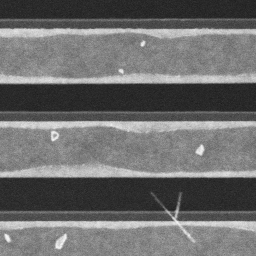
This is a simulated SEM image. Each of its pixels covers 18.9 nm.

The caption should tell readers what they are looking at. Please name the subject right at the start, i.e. lines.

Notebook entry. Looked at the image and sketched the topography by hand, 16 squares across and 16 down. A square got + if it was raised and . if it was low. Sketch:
................
++++++++++++++++
++++++++++++++++
++++++++++++++++
++++++++++++++++
................
................
++++++++++++++++
++++++++++++++++
++++++++++++++++
++++++++++++++++
................
................
++++++++++++++++
++++++++++++++++
++++++++++++++++